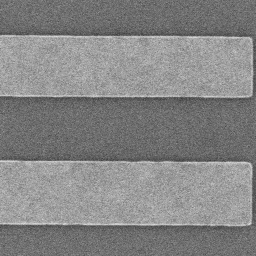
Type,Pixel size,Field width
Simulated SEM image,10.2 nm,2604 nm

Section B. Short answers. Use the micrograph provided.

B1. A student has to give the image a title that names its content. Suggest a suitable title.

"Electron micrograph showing wiring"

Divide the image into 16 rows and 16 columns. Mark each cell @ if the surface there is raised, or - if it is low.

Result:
----------------
----------------
@@@@@@@@@@@@@@@-
@@@@@@@@@@@@@@@@
@@@@@@@@@@@@@@@@
@@@@@@@@@@@@@@@@
----------------
----------------
----------------
----------------
@@@@@@@@@@@@@@@@
@@@@@@@@@@@@@@@@
@@@@@@@@@@@@@@@@
@@@@@@@@@@@@@@@@
----------------
----------------